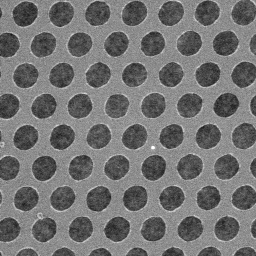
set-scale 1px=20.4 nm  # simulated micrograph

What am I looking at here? a regular array of raised bodies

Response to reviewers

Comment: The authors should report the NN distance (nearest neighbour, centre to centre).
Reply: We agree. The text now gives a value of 725 nanometres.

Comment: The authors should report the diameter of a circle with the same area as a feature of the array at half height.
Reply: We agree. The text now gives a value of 529 nanometres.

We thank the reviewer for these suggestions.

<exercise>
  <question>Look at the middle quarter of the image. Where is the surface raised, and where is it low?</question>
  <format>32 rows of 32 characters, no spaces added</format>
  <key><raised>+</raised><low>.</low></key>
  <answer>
++.....++++.....++++.....++++...
++....++++++...++++++...++++++..
++...+++++++...++++++...++++++..
++....++++++...++++++...++++++..
++....+++++....+++++....+++++...
+......+++......+++......+++....
................................
...+++...............+++......++
..+++++....+++++....+++++....+++
.++++++....+++++...++++++...++++
.++++++...++++++...++++++...++++
.++++++...++++++...++++++...++++
.+++++.....+++++....+++++....+++
..+++.......++.......++........+
................................
++.....++++......+++......+++...
++....+++++....++++++...++++++..
+++...++++++...++++++...++++++..
+++...++++++...++++++...++++++..
++....+++++....++++++...++++++..
++....++++.....+++++.....++++...
................................
...............................+
..+++++....+++++.....++++....+++
..+++++...++++++....+++++....+++
.++++++...++++++...++++++...++++
.++++++...++++++...++++++...++++
.++++++...++++++....+++++....+++
..++++.....++++.....++++.....+++
................................
.........+.......++.......++....
++.....++++....++++++....+++++..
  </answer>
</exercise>